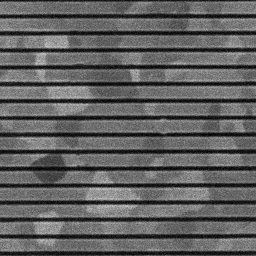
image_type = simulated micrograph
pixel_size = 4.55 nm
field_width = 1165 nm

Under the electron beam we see parallel lines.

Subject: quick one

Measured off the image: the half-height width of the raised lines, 52.3 nanometers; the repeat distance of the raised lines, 0.077 µm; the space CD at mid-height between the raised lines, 0.0244 µm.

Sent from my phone